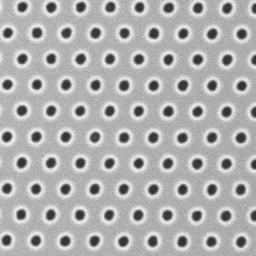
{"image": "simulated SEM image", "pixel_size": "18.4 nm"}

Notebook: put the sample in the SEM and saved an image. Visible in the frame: a regular array of holes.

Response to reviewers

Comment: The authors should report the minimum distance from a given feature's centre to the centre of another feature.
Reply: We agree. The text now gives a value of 534 nm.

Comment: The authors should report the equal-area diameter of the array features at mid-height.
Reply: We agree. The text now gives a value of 11.6 pixels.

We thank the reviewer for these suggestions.